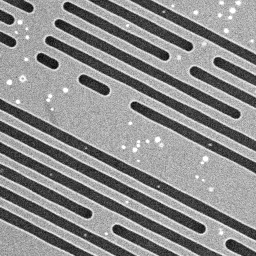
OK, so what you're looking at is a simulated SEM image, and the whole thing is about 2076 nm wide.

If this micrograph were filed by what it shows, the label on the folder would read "groups of lines, slits or small figures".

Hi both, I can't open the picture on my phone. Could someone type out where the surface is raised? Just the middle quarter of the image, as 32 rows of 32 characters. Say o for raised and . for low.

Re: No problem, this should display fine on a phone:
oooooo.....ooooo......oooooooooo
oooooooo......ooooo.....ooooooo.
oooooooooo......ooooo.....oooooo
oooo...ooooo......ooooo.....oooo
oooo.....ooooo......ooooo.....oo
ooooo......ooooo.....oooooo.....
ooooooo....ooooooo.....oooooo...
ooooooooo..ooooooooo.....ooooo..
oooooooooooooooooooooo.....ooooo
ooooooooooooooooo.oooooo.....ooo
oooooooooooooooo....oooooo.....o
ooooooooooooooooo......oooo.....
ooooooooooooooooooo......oooo...
ooooooooooooooooooooo.....ooooo.
ooooooooooooooooooooooo......ooo
ooooooooooooooooooooooooo......o
ooooooooooooooooooooooooooo.....
.oooooooooooooooooooooooooooo...
...oooooooooooooooooooooooooooo.
.....ooooooooooooooooooooooooooo
o......ooooooooooooooooooooooooo
oooo.....ooooooooooooooooooooooo
.ooooo.....ooooooooooooooooooooo
..ooooo......ooooooooooooooooooo
....oooooo.....ooooooooooooooooo
o......oooo......ooooooooooooooo
ooo.....ooooo......ooooooooooooo
ooooo.....ooooo......ooooooooooo
..ooooo......oooo......ooooooooo
....oooo......ooooo......ooooooo
......oooo......ooooo......ooooo
oo......ooooo.....ooooo......ooo